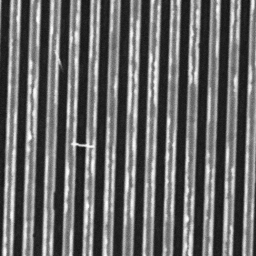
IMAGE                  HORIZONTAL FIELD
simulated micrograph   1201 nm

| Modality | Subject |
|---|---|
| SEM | parallel lines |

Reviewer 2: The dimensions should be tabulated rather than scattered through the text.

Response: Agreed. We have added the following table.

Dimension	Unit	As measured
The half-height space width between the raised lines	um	0.0486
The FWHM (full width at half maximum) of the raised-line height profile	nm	44.5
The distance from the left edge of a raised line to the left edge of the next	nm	93.7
